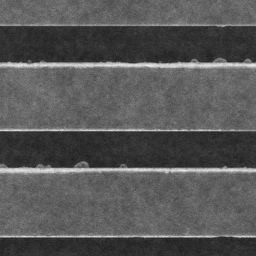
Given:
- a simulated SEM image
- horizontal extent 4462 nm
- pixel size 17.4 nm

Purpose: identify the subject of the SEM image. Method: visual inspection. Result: lines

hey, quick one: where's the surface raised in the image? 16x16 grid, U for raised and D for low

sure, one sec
UUUUUUUUUUUUUUUU
UUUUUUUUUUUUUUUU
DDDDDDDDDDDDDDDD
DDDDDDDDDDDDDDDD
UUUUUUUUUUUUUUUU
UUUUUUUUUUUUUUUU
UUUUUUUUUUUUUUUU
UUUUUUUUUUUUUUUU
DDDDDDDDDDDDDDDD
DDDDDDDDDDDDDDDD
DDDDDDDDDDDDDDDD
UUUUUUUUUUUUUUUU
UUUUUUUUUUUUUUUU
UUUUUUUUUUUUUUUU
UUUUUUUUUUUUUUUU
DDDDDDDDDDDDDDDD